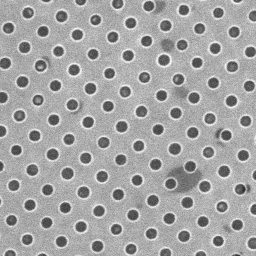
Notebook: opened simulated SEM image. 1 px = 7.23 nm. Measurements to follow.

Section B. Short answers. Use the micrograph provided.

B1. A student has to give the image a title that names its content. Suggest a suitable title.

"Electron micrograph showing a regular array of holes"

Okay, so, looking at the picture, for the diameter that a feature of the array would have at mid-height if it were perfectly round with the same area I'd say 83.2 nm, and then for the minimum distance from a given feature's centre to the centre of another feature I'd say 0.171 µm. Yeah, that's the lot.